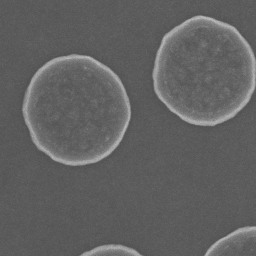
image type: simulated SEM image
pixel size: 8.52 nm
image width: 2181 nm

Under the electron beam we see raised bodies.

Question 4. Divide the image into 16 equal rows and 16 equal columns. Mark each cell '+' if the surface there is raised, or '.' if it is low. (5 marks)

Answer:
................
............++..
..........+++++.
..........++++++
...++++...++++++
..++++++..++++++
..++++++..+++++.
..++++++....++..
..++++++........
...++++.........
................
................
................
................
...............+
.......+.....+++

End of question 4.